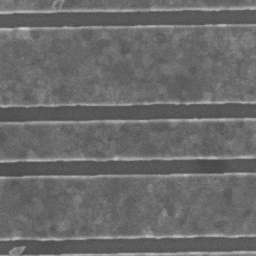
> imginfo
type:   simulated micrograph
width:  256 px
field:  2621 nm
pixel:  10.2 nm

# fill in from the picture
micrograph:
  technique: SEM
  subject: lines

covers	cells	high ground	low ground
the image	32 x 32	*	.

********************************
******..........................
................................
....****************************
********************************
********************************
********************************
********************************
********************************
********************************
********************************
********************************
********************************
................................
................................
********************************
********************************
********************************
********************************
********************************
................................
................................
********************************
********************************
********************************
********************************
********************************
********************************
********************************
********************************
................................
................................